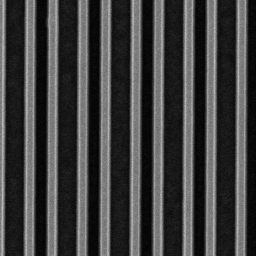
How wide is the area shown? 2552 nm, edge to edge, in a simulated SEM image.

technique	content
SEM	parallel lines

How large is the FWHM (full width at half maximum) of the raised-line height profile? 89.7 nanometres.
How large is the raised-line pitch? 26.4 pixels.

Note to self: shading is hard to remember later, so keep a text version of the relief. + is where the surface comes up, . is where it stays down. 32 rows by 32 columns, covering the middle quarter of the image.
....++...++......++...++......++
....++...++......++...++......++
....++...++......++...++......++
....++...++......++...++......++
....++...++......++....+......++
....++...++......++...++......++
....++...++......++...++......++
....++...++......++...++......++
....++...++......++...++......++
....++...++......++...++......++
....++...++......++...++......++
....++...++......++...++......++
....++...++......++...++......++
....++...++......++...++......++
....++...++......++...++......++
....++...++......++...++......++
....++...++......++...++......++
....++...++......++...++......++
....++...++......++...++......++
....++...++......++...++......++
....++...++......++...++......++
....++...++......++...++......++
....++...++......++...++......++
....++...++......++...++......++
....++...++......++...++......++
....++...++......++....+......++
....++...++......++....+......++
....++...++......++...++......++
....++...++......++...++......++
....++...++......++...++......++
....++...++......++...++......++
....++...++......++...++......++